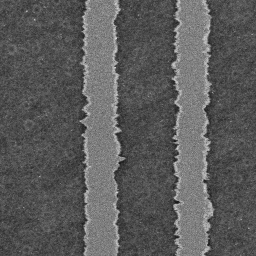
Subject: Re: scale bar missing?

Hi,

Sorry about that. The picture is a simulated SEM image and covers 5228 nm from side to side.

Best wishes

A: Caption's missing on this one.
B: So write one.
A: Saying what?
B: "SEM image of one or a few lines or trenches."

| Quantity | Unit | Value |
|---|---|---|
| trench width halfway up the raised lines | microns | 1.26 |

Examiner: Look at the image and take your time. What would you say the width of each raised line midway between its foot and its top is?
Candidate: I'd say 0.605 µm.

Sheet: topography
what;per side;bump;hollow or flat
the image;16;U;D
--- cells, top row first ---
DDDDDUUDDDDUUDDD
DDDDDUUDDDDUUDDD
DDDDDUUDDDDUUDDD
DDDDDUUDDDDUUDDD
DDDDDUUDDDDUUDDD
DDDDDUUDDDDUUDDD
DDDDDUUDDDDUUDDD
DDDDDUUDDDDUUDDD
DDDDDUUDDDDUUDDD
DDDDDUUUDDDUUDDD
DDDDDUUDDDDUUDDD
DDDDDUUDDDDUUDDD
DDDDDUUDDDDUUDDD
DDDDDUUDDDDUUDDD
DDDDDUUDDDDUUDDD
DDDDDUUDDDDUUDDD